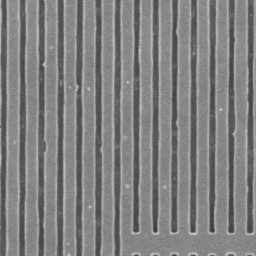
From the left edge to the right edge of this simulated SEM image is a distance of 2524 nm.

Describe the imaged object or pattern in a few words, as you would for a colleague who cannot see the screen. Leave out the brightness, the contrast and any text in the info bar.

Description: parallel lines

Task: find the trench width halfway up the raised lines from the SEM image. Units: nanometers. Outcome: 62.8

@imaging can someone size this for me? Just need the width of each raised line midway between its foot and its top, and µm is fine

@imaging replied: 0.126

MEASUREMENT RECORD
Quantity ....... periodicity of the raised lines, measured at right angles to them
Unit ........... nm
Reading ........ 187